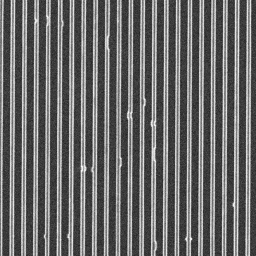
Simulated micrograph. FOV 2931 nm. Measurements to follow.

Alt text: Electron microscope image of parallel lines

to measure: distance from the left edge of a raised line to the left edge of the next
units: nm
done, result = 135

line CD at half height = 41.5 nm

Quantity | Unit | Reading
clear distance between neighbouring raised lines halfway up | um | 0.093